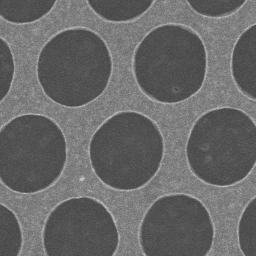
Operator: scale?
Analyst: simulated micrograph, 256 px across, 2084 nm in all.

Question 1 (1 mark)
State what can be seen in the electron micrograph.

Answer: holes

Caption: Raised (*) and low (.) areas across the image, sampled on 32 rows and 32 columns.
.......****........*****......**
......******......*******....***
*...**********..****************
*******************....********.
*******.....******.......*****..
.*****.......*****.......*****..
.****.........***.........***...
..***.........***.........***...
..***.........***.........***...
..***.........***........****...
.****........****........*****..
.*****.......*****.......*****..
*******.....********...*********
********************************
***..*********....*******......*
*......******......*****........
........****........****........
........***.........****........
........***.........***.........
........***.........***.........
........***.........****........
........****.......*****.......*
.......******......******.....**
*.....*********..***************
*********************..*********
********....*******......******.
.*****........****........****..
..****........****........****..
...***.........***.........***..
...**..........**..........***..
...***.........***........****..
..****........****........****..